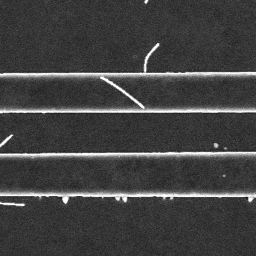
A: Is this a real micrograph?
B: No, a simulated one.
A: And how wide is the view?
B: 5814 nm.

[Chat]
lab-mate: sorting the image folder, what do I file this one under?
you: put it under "lines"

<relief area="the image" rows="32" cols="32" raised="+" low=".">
................................
................................
................................
................................
................................
................................
................................
................................
................................
++++++++++++++++++++++++++++++++
++++++++++++++++++++++++++++++++
++++++++++++++++++++++++++++++++
++++++++++++++++++++++++++++++++
++++++++++++++++++++++++++++++++
................................
................................
................................
................................
................................
++++++++++++++++++++++++++++++++
++++++++++++++++++++++++++++++++
++++++++++++++++++++++++++++++++
++++++++++++++++++++++++++++++++
++++++++++++++++++++++++++++++++
.......++......++......+++++++++
................................
................................
................................
................................
................................
................................
................................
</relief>